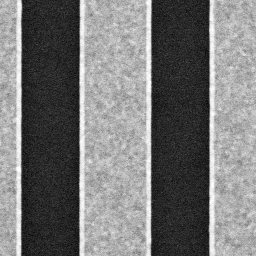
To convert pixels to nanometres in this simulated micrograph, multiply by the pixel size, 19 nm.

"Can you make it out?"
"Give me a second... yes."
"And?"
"wiring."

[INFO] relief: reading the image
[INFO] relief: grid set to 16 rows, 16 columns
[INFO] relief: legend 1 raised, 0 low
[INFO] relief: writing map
1000011110000111
1000011110000111
1000011110000111
1000011110000111
1000011110000111
1000011110000111
1000011110000111
1000011110000111
1000011110000111
1000011110000111
1000011110000111
1000011110000111
1000011110000111
1000011110000111
1000011110000111
1000011110000111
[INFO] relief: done